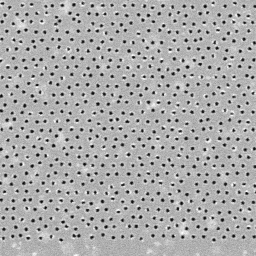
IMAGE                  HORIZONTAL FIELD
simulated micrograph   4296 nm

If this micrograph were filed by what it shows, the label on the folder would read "a regular array of holes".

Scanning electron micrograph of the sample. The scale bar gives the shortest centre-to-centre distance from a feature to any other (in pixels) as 8.09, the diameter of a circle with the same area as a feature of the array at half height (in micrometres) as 0.0656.